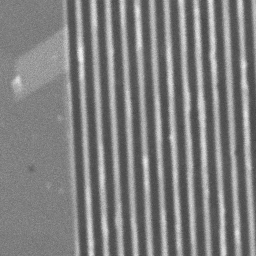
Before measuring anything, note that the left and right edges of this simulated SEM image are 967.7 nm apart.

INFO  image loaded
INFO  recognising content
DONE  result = parallel lines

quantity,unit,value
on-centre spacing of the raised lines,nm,55.6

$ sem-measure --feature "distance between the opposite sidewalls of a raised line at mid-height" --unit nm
19.4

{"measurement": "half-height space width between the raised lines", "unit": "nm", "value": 38.2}